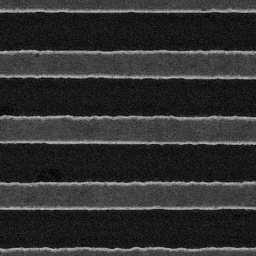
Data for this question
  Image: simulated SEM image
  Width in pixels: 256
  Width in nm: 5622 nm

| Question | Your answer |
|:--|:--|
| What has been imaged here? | lines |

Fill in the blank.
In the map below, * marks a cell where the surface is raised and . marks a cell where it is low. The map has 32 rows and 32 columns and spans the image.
********************************
................................
................................
................................
................................
................................
*************.******************
********************************
********************************
********************************
................................
................................
................................
................................
................................
********************************
********************************
********************************
................................
................................
................................
................................
................................
********************************
********************************
********************************
................................
................................
................................
................................
................................
********************************